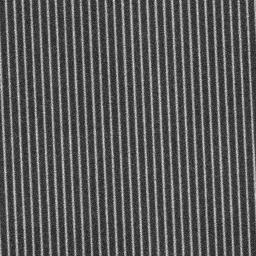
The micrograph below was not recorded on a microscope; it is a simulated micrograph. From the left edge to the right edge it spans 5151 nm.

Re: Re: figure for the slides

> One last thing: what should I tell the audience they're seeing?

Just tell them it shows parallel lines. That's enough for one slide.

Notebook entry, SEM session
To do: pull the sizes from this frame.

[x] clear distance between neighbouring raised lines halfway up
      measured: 141 nm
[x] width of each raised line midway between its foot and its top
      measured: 1.37 px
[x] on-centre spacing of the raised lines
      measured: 8.3 px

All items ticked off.